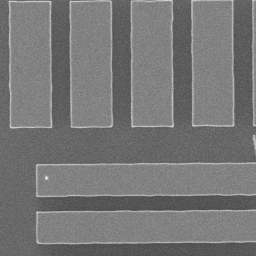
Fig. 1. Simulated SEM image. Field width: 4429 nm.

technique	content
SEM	groups of lines, slits or small figures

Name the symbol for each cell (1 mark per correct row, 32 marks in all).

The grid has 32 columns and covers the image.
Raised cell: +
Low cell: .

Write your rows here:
.+++++...+++++..+++++...+++++...
.+++++...+++++..++++++..+++++...
.+++++...+++++..++++++..+++++...
.+++++...+++++..+++++...+++++...
.+++++...+++++..+++++...+++++...
.+++++...+++++..+++++...+++++...
.+++++...+++++..++++++..+++++...
.+++++...+++++..++++++..+++++...
.+++++...+++++..++++++..+++++...
.+++++...+++++..++++++..+++++...
.+++++...+++++..++++++..+++++...
.+++++...+++++..++++++..+++++...
.+++++...+++++..++++++..+++++...
.+++++...+++++..++++++..+++++...
.+++++...+++++..++++++..+++++...
.+++++...+++++..++++++..+++++...
................................
................................
................................
................................
.................+++++++++++++++
.....+++++++++++++++++++++++++++
.....+++++++++++++++++++++++++++
.....+++++++++++++++++++++++++++
.....++++.++..++..+.............
................................
......++++++++++++++++++++++++++
.....+++++++++++++++++++++++++++
.....+++++++++++++++++++++++++++
.....+++++++++++++++++++++++++++
................................
................................